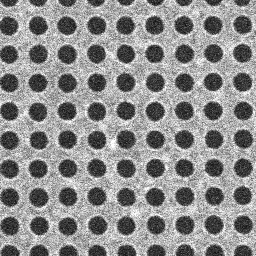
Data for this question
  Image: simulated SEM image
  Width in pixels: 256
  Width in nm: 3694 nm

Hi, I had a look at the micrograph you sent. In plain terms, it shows a regular array of holes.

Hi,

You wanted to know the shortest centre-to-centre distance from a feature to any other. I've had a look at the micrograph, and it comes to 28.4 px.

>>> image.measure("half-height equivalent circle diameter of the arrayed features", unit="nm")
286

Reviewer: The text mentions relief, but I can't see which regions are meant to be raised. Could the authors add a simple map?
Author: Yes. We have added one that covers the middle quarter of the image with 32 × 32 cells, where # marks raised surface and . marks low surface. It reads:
################################
################################
..#####..#####..#####...#####...
...###....###.....###....###....
...###.....##.....##.....###....
...###....###.....###....###....
...####...####...####...#####...
################################
################################
..######.#####..######.######..#
...###....###.....###....###....
...###.....##.....##.....###....
...###....###.....##.....###....
...###....####...####....###....
################################
################################
.#############..######.######..#
...###....###.....###....###....
...###.....##.....##.....##.....
...###.....##.....###....###....
...###....####...####....###....
########.#######################
################################
################################
...###....###....####....###....
...###.....##.....##.....###....
...###.....##.....##.....###....
...###....###.....###....###....
..######.#####..################
################################
################################
...###....####...####...####....